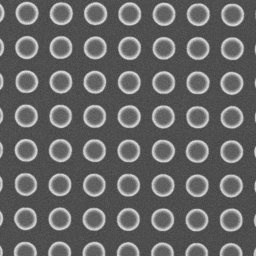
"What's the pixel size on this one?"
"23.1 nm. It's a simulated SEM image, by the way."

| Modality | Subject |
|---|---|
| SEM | an array of small figures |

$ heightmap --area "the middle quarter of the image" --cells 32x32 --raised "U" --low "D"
DDDDDDDDDDDDDDDDDDDDDDDDDDDDDDDD
DDDDDDDDDDDDDDDDDDDDDDDDDDDDDDDD
UDDDDDUUUUDDDDDUUUDDDDDUUUUDDDDD
UUDDDUUUUUDDDDUUUUUDDDUUUUUDDDDU
UUDDDUUUUUDDDDUUUUUDDDUUUUUUDDDU
UUDDDUUUUUDDDDUUUUUDDDUUUUUUDDDU
UDDDDDUUUUDDDDUUUUDDDDDUUUUDDDDU
DDDDDDDDDDDDDDDDDDDDDDDDDDDDDDDD
DDDDDDDDDDDDDDDDDDDDDDDDDDDDDDDD
DDDDDDDDDDDDDDDDDDDDDDDDDDDDDDDD
DDDDDDDUUDDDDDDDDDDDDDDDDDDDDDDD
UDDDDUUUUUDDDDUUUUDDDDDUUUUDDDDU
UUDDDUUUUUDDDDUUUUUDDDUUUUUDDDDU
UUDDDUUUUUDDDDUUUUUDDDUUUUUDDDDU
UDDDDUUUUUDDDDUUUUUDDDUUUUUDDDDU
DDDDDDUUUDDDDDDUUUDDDDDUUUDDDDDD
DDDDDDDDDDDDDDDDDDDDDDDDDDDDDDDD
DDDDDDDDDDDDDDDDDDDDDDDDDDDDDDDD
DDDDDDDDDDDDDDDDDDDDDDDDDDDDDDDD
UDDDDDUUUDDDDDDUUUDDDDDUUUDDDDDD
UUDDDUUUUUDDDDUUUUUDDDUUUUUDDDDU
UUDDDUUUUUDDDDUUUUUDDDUUUUUUDDDU
UUDDDUUUUUDDDDUUUUUDDDUUUUUDDDDU
UDDDDDUUUUDDDDUUUUDDDDDUUUUDDDDU
DDDDDDDDDDDDDDDDDDDDDDDDDDDDDDDD
DDDDDDDDDDDDDDDDDDDDDDDDDDDDDDDD
DDDDDDDDDDDDDDDDDDDDDDDDDDDDDDDD
DDDDDDDDDDDDDDDDDDDDDDDDDDDDDDDD
UDDDDUUUUUDDDDUUUUDDDDDUUUUDDDDU
UUDDDUUUUUDDDDUUUUUDDDUUUUUDDDDU
UUDDDUUUUUDDDDUUUUUDDDUUUUUUDDDU
UDDDDUUUUUDDDDUUUUUDDDUUUUUDDDDU